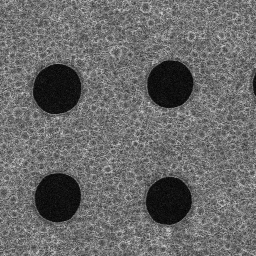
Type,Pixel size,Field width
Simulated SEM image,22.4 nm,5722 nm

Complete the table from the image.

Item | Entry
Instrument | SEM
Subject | holes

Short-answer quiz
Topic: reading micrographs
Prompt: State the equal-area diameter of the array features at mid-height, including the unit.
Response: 47.7 px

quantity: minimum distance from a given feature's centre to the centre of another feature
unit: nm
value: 2450